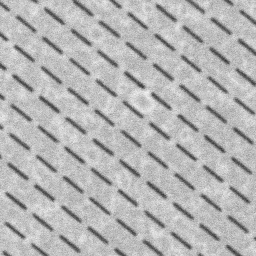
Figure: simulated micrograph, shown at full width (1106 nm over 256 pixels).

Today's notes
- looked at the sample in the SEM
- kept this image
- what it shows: a regular array of holes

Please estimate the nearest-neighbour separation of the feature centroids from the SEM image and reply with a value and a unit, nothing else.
126 nm